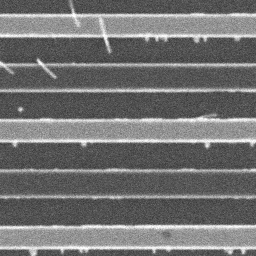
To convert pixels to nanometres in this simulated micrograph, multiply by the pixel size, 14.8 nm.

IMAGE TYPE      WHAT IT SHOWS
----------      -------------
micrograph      lines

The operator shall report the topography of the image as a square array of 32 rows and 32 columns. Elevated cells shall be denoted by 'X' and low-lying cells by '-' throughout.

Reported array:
--------------------------------
--------------------------------
XXXXXXXXXXXXXXXXXXXXXXXXXXXXXXXX
XXXXXXXXXXXXXXXXXXXXXXXXXXXXXXXX
XXXXXXXXXXXXXXXXXXXXXXXXXXXXXXXX
--------------------------------
--------------------------------
--------------------------------
XXXXXXXXXXXXXXXXXXXXXXXXXXXXXXXX
XXXXXXXXXXXXXXXXXXXXXXXXXXXXXXXX
XXXXXXXXXXXXXXXXXXXXXXXXXXXXXXXX
--------------------------------
--------------------------------
--------------------------------
--------------------------------
XXXXXXXXXXXXXXXXXXXXXXXXXXXXXXXX
XXXXXXXXXXXXXXXXXXXXXXXXXXXXXXXX
XXXXXXXXXXXXXXXXXXXXXXXXXXXXXXXX
--------------------------------
--------------------------------
--------------------------------
XXXXXXXXXXXXXXXXXXXXXXXXXXXXXXXX
XXXXXXXXXXXXXXXXXXXXXXXXXXXXXXXX
XXXXXXXXXXXXXXXXXXXXXXXXXXXXXXXX
XXXXXXXXXXXXXXXXXXXXXXXXXXXXXXXX
--------------------------------
--------------------------------
--------------------------------
XXXXXXXXXXXXXXXXXXXXXXXXXXXXXXXX
XXXXXXXXXXXXXXXXXXXXXXXXXXXXXXXX
XXXXXXXXXXXXXXXXXXXXXXXXXXXXXXXX
--------------------------------